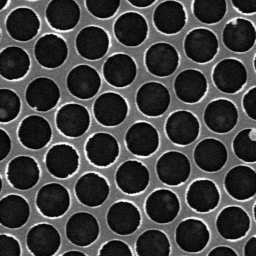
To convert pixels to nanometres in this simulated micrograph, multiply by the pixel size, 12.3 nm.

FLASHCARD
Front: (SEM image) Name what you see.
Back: a regular array of holes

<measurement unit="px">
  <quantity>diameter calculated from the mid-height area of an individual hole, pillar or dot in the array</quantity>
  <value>33.9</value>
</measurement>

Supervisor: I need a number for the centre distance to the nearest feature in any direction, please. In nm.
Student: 484